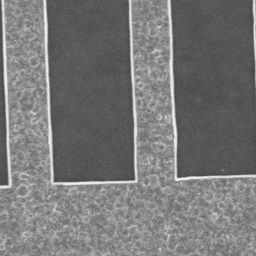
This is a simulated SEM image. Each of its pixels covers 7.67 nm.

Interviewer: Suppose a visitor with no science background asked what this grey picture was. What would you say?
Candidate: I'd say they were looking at one or a few lines or trenches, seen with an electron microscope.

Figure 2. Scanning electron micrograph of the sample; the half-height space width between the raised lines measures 646 nm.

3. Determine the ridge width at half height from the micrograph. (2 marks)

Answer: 323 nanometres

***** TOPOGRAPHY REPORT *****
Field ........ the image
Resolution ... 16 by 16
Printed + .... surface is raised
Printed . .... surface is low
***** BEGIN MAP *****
+++.....+++.....
+++.....+++.....
+++.....+++.....
+++.....+++.....
+++.....+++.....
+++.....+++.....
+++.....+++.....
+++.....+++.....
+++.....+++.....
.++.....+++.....
.++.....+++.....
++++++++++++++++
++++++++++++++++
++++++++++++++++
++++++++++++++++
++++++++++++++++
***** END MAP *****